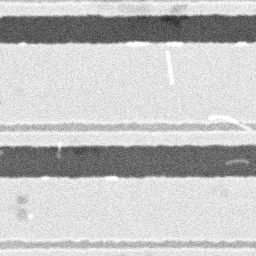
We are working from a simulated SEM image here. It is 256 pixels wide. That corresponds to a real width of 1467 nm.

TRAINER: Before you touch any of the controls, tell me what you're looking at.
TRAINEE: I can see lines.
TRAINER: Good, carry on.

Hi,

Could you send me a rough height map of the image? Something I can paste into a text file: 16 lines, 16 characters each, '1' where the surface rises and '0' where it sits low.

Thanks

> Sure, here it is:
1111111111111111
0000000000000000
0000000000000000
1111111111111111
1111111111111111
1111111111111111
1111111111111111
1111111111111111
1111111111111111
0000000000000000
0000000000000000
1111111111111111
1111111111111111
1111111111111111
1111111111111111
1111111111111111